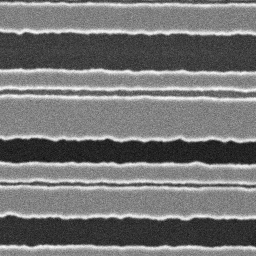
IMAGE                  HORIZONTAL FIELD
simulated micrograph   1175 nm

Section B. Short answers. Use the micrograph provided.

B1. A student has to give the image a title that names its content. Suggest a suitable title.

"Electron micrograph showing lines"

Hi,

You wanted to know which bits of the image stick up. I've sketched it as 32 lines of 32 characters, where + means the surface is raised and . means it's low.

++++++++++++++++++++++++++++++++
++++++++++++++++++++++++++++++++
++++++++++++++++++++++++++++++++
++++++++++++++++++++++++++++++++
................................
................................
................................
................................
................................
++++++++++++++++++++++++++++++++
++++++++++++++++++++++++++++++++
++++++++++++++++++++++++++++++++
++++++++++++++++++++++++++++++++
++++++++++++++++++++++++++++++++
++++++++++++++++++++++++++++++++
++++++++++++++++++++++++++++++++
++++++++++++++++++++++++++++++++
......+..+....++.+++++.+++.+++++
................................
................................
+++++++++++++++.+++.++.+++......
++++++++++++++++++++++++++++++++
++++++++++++++++++++++++++++++++
++++++++++++++++++++++++++++++++
++++++++++++++++++++++++++++++++
++++++++++++++++++++++++++++++++
++++++++++++++++++++++++++++++++
................................
................................
................................
................................
++++++++++++++++++++++++++++++++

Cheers